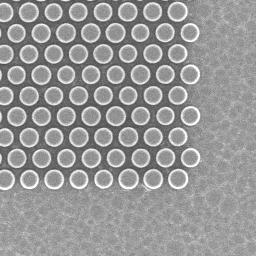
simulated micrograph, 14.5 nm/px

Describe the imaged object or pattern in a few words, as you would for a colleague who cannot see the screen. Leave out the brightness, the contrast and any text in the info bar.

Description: a regular array of raised bodies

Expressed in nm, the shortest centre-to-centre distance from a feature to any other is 346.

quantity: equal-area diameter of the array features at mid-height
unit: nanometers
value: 264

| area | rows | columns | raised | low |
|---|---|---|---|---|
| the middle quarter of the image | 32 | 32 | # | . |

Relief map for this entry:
..................##....##.....#
##...####..####..####..####...##
##...####..####..####..####..###
##...####..####..####..####..###
##...###....##....##....##....##
................................
..###...####..####..####...###..
..####..####..####..####..#####.
..####..####..####..####..#####.
..###...###...###....###...###..
................................
##...###...####..####...###...##
###..####..####..####..####..###
###..####..####..####..#####.###
##...####..####...###...###...##
................................
..###....##...####...###...###..
..####..####..####..####..#####.
.#####..####..####..####..#####.
..####..####..####...###...###..
...#...........##...............
#.....##....##....##....###...##
###..####..####..####..####...##
###..####..####..####..#####.###
###..####..####..####..####...##
##...###....##....##.....#.....#
...............##.....#.....#...
..###...####..####..####...###..
..####..####..####..#####.#####.
..####..####..####..#####.#####.
..###....##....###...###...###..
................................